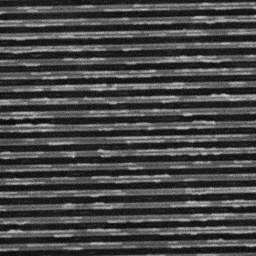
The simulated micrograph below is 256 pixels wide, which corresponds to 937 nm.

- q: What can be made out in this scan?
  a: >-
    parallel lines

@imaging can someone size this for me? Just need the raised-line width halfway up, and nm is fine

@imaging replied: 20.6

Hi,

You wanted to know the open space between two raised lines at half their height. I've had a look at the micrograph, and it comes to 0.0275 µm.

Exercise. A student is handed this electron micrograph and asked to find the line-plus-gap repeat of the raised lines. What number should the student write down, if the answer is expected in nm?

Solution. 48.3